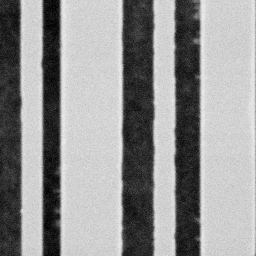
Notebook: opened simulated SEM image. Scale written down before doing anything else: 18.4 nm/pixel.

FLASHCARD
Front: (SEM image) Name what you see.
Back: lines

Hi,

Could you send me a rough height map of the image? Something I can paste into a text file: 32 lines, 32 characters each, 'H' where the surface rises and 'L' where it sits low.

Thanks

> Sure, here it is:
LLLHHLLLHHHHHHHLLLLHHHLLLHHHHHHH
LLLHHLLLHHHHHHHLLLLHHHLLLHHHHHHH
LLLHHLLLHHHHHHHLLLLHHHLLLHHHHHHH
LLLHHLLLHHHHHHHLLLLHHHLLLHHHHHHH
LLLHHLLLHHHHHHHLLLLHHHLLLHHHHHHH
LLLHHLLLHHHHHHHLLLLHHHLLLHHHHHHH
LLLHHLLLHHHHHHHLLLLHHHLLLHHHHHHH
LLLHHLLLHHHHHHHLLLLHHHLLLHHHHHHH
LLLHHLLLHHHHHHHLLLLHHHLLLHHHHHHH
LLLHHLLLHHHHHHHLLLLHHHLLLHHHHHHH
LLLHHLLLHHHHHHHLLLLHHHLLLHHHHHHH
LLLHHLLLHHHHHHHLLLLHHHLLLHHHHHHH
LLLHHLLLHHHHHHHLLLLHHHLLLHHHHHHH
LLLHHLLLHHHHHHHLLLLHHHLLLHHHHHHH
LLLHHLLLHHHHHHHLLLLHHHLLLHHHHHHH
LLLHHLLLHHHHHHHLLLLHHHLLLHHHHHHH
LLLHHLLLHHHHHHHLLLLHHHLLLHHHHHHH
LLLHHLLLHHHHHHHLLLLHHHLLLHHHHHHH
LLLHHLLLHHHHHHHLLLLHHHLLLHHHHHHH
LLLHHLLLHHHHHHHLLLLHHHLLLHHHHHHH
LLLHHLLLHHHHHHHLLLLHHHLLLHHHHHHH
LLLHHLLLHHHHHHHLLLLHHHLLLHHHHHHH
LLLHHLLLHHHHHHHLLLLHHHLLLHHHHHHH
LLLHHLLLHHHHHHHLLLLHHHLLLHHHHHHH
LLLHHLLLHHHHHHHLLLLHHHLLLHHHHHHH
LLLHHLLLHHHHHHHLLLLHHHLLLHHHHHHH
LLLHHLLLHHHHHHHLLLLHHHLLLHHHHHHH
LLLHHLLLHHHHHHHLLLLHHHLLLHHHHHHH
LLLHHLLLHHHHHHHLLLLHHHLLLHHHHHHH
LLLHHLLLHHHHHHHLLLLHHHLLLHHHHHHH
LLLHHLLLHHHHHHHLLLLHHHLLLHHHHHHH
LLLHHLLLHHHHHHHLLLLHHHLLLHHHHHHH